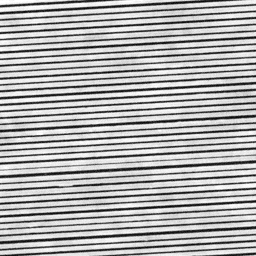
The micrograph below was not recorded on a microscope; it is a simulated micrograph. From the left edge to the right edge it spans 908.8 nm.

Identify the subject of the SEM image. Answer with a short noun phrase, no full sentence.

parallel lines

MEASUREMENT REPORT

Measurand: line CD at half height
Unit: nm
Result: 15.1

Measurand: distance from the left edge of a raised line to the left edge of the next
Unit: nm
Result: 23.2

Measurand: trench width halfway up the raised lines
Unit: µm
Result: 0.0089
